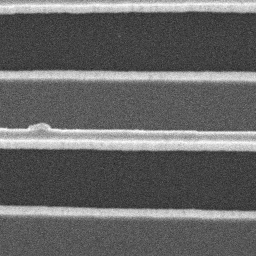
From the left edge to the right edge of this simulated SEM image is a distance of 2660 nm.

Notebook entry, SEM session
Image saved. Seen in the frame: lines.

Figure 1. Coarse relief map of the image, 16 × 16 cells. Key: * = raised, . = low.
********........
................
................
................
................
****************
****************
****************
****************
................
................
................
................
****************
****************
****************